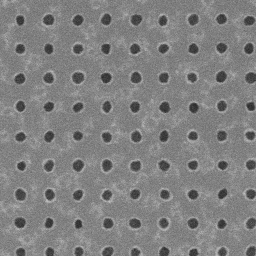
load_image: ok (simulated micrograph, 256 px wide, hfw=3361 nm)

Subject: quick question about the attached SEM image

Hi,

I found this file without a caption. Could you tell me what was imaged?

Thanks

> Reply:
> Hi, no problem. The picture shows a regular array of holes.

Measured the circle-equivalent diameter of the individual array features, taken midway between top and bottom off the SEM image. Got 143 nanometers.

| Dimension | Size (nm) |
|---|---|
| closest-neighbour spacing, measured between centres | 370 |